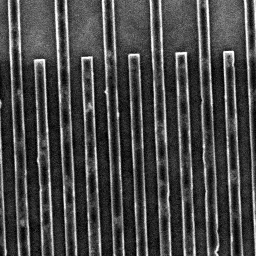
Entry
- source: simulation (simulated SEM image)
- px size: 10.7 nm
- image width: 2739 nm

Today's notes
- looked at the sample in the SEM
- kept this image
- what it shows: parallel lines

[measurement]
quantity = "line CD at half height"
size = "116 nanometres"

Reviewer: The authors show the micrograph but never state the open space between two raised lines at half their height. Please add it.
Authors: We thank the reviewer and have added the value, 0.138 µm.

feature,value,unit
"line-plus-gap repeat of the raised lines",253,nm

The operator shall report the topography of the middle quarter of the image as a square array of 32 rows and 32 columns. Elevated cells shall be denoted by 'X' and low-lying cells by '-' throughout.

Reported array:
X----XX---XXX---XXX---XXX---XXX-
X----XX---XXX---XXX---XXX---XXX-
X----XX---XXX---XXX---XXX---XXX-
X----XX----XX---XXX---XXX---XXX-
X----XX----XX----XX---XXX---XXX-
X----XX----XX----XX----XX---XXX-
X----XX---XXX----XX----XX---XXX-
X----XX---XXX----XX----XX----XX-
X----XX----XX----XX----XX----XX-
X----XX----XX----XX----XX----XX-
X----XX----XX----XX----XX----XX-
X----XX----XX----XX----XX----XX-
XX---XX----XXX---XX----XX----XX-
XX---XXX---XXX---XX----XX----XX-
XX---XXX---XXX---XX----XX----XX-
XX---XXX---XXX---XXX---XX----XX-
XX---XXX---XXX---XXX---XX----XX-
XX---XXX---XXX---XXX---XX----XX-
XX---XXX---XXX---XXX---XXX---XXX
XX---XXX---XXX---XXX---XXX---XXX
XX----XX---XXX---XXX---XXX---XXX
XX----XX----XX---XXX---XXX---XXX
XX----XX----XX---XXX---XXX---XXX
XX----XX----XX---XXX---XXX---XXX
XX---XXX----XX---XXX---XXX---XXX
XX----XX----XX---XXX---XXX---XXX
XX----XX----XX---XXX---XXX---XXX
XX----XX----XX---XXX---XXX---XXX
XX----XX----XX----XX---XXX---XXX
XX----XX----XX----XX----XX---XXX
XX----XX----XX----XX----XX----XX
XX----XX----XX----XX----XX----XX